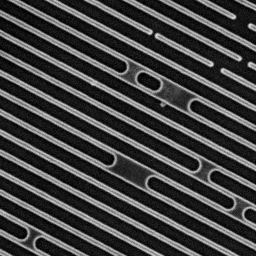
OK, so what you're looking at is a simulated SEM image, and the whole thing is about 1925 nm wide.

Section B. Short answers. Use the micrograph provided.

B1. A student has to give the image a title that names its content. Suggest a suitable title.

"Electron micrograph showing parallel lines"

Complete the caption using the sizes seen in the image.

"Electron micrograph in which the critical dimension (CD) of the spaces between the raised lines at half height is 104 nm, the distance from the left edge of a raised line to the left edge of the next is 132 nm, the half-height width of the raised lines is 25.8 nanometres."